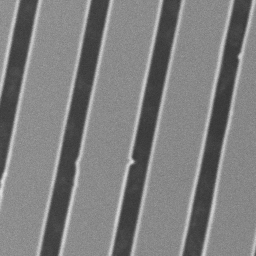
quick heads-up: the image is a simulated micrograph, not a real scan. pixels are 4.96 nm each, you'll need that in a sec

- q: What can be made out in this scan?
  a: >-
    one or a few lines or trenches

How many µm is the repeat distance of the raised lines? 0.347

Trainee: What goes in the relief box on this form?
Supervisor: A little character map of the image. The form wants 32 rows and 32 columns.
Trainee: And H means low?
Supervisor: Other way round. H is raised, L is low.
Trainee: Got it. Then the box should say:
HHLLLHHHHHHLLLHHHHHHLLLHHHHHHLLH
HHLLLHHHHHHLLHHHHHHHLLHHHHHHHLLH
HHLLHHHHHHHLLHHHHHHHLLHHHHHHHLLH
HHLLHHHHHHHLLHHHHHHHLLHHHHHHLLLH
HHLLHHHHHHLLLHHHHHHLLLHHHHHHLLLH
HLLLHHHHHHLLLHHHHHHLLLHHHHHHLLHH
HLLLHHHHHHLLHHHHHHHLLHHHHHHHLLHH
HLLHHHHHHHLLHHHHHHHLLHHHHHHHLLHH
HLLHHHHHHHLLHHHHHHHLLHHHHHHLLLHH
HLLHHHHHHLLLHHHHHHLLLHHHHHHLLLHH
LLLHHHHHHLLLHHHHHHLLLHHHHHHLLHHH
LLLHHHHHHLLHHHHHHHLLHHHHHHHLLHHH
LLHHHHHHHLLHHHHHHHLLHHHHHHHLLHHH
LLHHHHHHHLLHHHHHHHLLHHHHHHLLLHHH
LLHHHHHHLLLHHHHHHLLLHHHHHHLLLHHH
LLHHHHHHLLLHHHHHHLLLHHHHHHLLHHHH
LLHHHHHHLLHHHHHHHLLHHHHHHHLLHHHH
LHHHHHHHLLHHHHHHHLLHHHHHHHLLHHHH
LHHHHHHHLLHHHHHHHLLHHHHHHLLLHHHH
LHHHHHHLLLHHHHHHLLLHHHHHHLLLHHHH
LHHHHHHLLLHHHHHHLLLHHHHHHLLHHHHH
LHHHHHHLLLHHHHHHLLHHHHHHHLLHHHHH
HHHHHHHLLHHHHHHHLLHHHHHHHLLHHHHH
HHHHHHHLLHHHHHHHLLHHHHHHLLLHHHHH
HHHHHHLLLHHHHHHLLLHHHHHHLLLHHHHH
HHHHHHLLLHHHHHHLLLHHHHHHLLHHHHHH
HHHHHHLLLHHHHHHLLHHHHHHHLLHHHHHH
HHHHHHLLHHHHHHHLLHHHHHHHLLHHHHHH
HHHHHHLLHHHHHHHLLHHHHHHLLLHHHHHH
HHHHHLLLHHHHHHLLLHHHHHHLLLHHHHHH
HHHHHLLLHHHHHHLLLHHHHHHLLLHHHHHH
HHHHHLLHHHHHHHLLHHHHHHHLLHHHHHHH